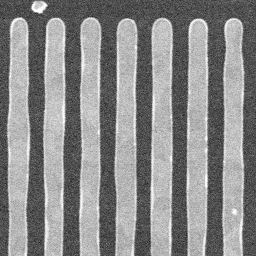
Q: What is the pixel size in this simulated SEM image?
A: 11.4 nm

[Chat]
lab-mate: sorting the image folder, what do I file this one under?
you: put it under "groups of lines, slits or small figures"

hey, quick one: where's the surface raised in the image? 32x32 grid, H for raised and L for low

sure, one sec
LLLLHLLLLLLLLLLLLLLLLLLLLLLLLLLL
LLLLLLLLLLLLLLLLLLLLLLLLLLLLLLLL
LLHLLLHLLLLHLLLHLLLLHLLLLLLLLHLL
LHHLLLHHLLHHLLLHHLLHHLLLHHLLHHLL
LHHLLLHHLLHHLLLHHLLHHHLLHHLLHHLL
LHHLLLHHLLHHLLLHHLLHHLLLHHLLHHLL
LHHLLLHHLLHHLLLHHLLHHLLLHHLLHHLL
LHHLLLHHLLHHLLLHHLLHHLLLHHLLHHLL
LHHLLLHHLLHHLLLHHLLHHLLLHHLLHHLL
LHHHLLHHLLHHLLLHHLLHHLLLHHLLHHLL
LHHLLLHHLLHHLLLHHLLHHLLLHHLLHHLL
LHHLLLHHLLHHLLLHHLLHHLLLHHLLHHLL
LHHLLLHHLLHHLLLHHLLHHLLLHHLLHHLL
LHHLLLHHLLHHLLLHHLLHHLLLHHLLHHLL
LHHHLLHHLLHHLLLHHLLHHLLLHHLLHHLL
LHHHLLHHLLHHLLLHHLLHHLLLHHLLHHLL
LHHHLLHHLLHHLLLHHLLHHLLLHHLLHHLL
LHHHLLHHLLHHLLLHHLLHHLLLHHLLHHLL
LHHHLLHHLLHHLLHHHLLHHLLLHHLLHHLL
LHHHLLHHLLHHLLHHHLLHHLLLHHLLHHLL
LHHHLLHHLLHHLLHHHLLHHLLHHHLLHHLL
LHHLLLHHLLHHLLHHHLLHHLLLHHLLHHLL
LHHLLLHHLLHHLLHHHLLHHLLLHHLLHHLL
LHHLLLHHLLHHLLLHHLLHHLLHHHLLHHLL
LHHLLLHHLLHHLLLHHLLHHLLHHHLLHHLL
LHHLLLHHLLHHLLLHHLLHHLLHHHLLHHLL
LHHLLLHHLLHHLLLHHLLHHLLLHHLLHHLL
LHHLLLHHLLHHLLLHHLLHHLLLHHLLHHLL
LHHLLLHHLLHHLLLHHLLHHLLLHHLLHHLL
LHHLLLHHLLHHLLLHHLLHHLLLHHLLHHLL
LHHLLLHHLLHHLLLHHLLHHLLLHHLLHHLL
LHHLLLHHLLHHLLHHHLLHHLLLHLLLHHLL